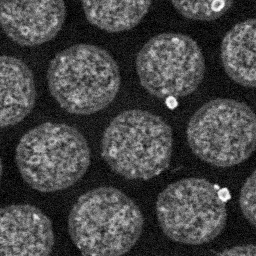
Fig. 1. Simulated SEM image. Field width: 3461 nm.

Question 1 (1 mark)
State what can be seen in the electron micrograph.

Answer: raised bodies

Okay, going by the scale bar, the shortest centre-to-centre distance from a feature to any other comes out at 1140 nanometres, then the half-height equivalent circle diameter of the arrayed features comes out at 906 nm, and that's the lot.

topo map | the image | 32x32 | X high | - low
XXXXXXXX---XXXXXXX----XXXXXX----
XXXXXXXX---XXXXXXX-----XXXXX----
XXXXXXXX----XXXXX---------------
-XXXXXX-------X---------------XX
--XXXX---------------X-------XXX
-------------------XXXXX----XXXX
--------XXXXX-----XXXXXXX---XXXX
X------XXXXXXX---XXXXXXXX---XXXX
XXX----XXXXXXX---XXXXXXXX----XXX
XXXX--XXXXXXXXX---XXXXXXX----XXX
XXXX--XXXXXXXXX---XXXXXX-------X
XXXX---XXXXXXX-----XXXX---------
XXXX----XXXXXX-------X----------
XXXX-----XXX--------------XXXX--
XXX------------XXXX------XXXXXX-
--------------XXXXXX----XXXXXXXX
----XXXXX-----XXXXXXX---XXXXXXXX
---XXXXXXX---XXXXXXXX---XXXXXXXX
---XXXXXXXX--XXXXXXXX---XXXXXXX-
--XXXXXXXXX--XXXXXXXX----XXXXXX-
---XXXXXXXX---XXXXXX------------
---XXXXXXX-----XXXX-------------
----XXXXX----------------------X
-----XX--------------XXXXX-----X
-----------XXXX-----XXXXXXXXX-XX
----------XXXXXX----XXXXXXXX--XX
XXXX-----XXXXXXXX---XXXXXXXX---X
XXXXXX---XXXXXXXX---XXXXXXXX----
XXXXXX---XXXXXXXX----XXXXXX-----
XXXXXX---XXXXXXXX-----XXXX------
XXXXXX----XXXXXX----------------
XXXXXX-----XXXX--------------XXX